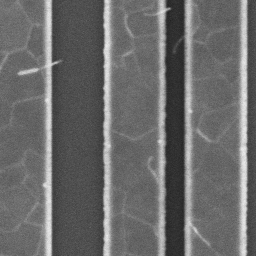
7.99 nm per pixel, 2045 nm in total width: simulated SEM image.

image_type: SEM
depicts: lines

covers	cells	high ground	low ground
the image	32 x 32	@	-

@@@@@@-------@@@@@@@@--@@@@@@@@-
@@@@@@-------@@@@@@@@--@@@@@@@@-
@@@@@@-------@@@@@@@@--@@@@@@@@-
@@@@@@-------@@@@@@@---@@@@@@@@-
@@@@@@-------@@@@@@@@--@@@@@@@@-
@@@@@@-------@@@@@@@@--@@@@@@@@-
@@@@@@-------@@@@@@@@--@@@@@@@@-
@@@@@@-------@@@@@@@---@@@@@@@@-
@@@@@@-------@@@@@@@@--@@@@@@@@-
@@@@@@-------@@@@@@@@--@@@@@@@@-
@@@@@@-------@@@@@@@@--@@@@@@@@-
@@@@@@-------@@@@@@@@--@@@@@@@@-
@@@@@@-------@@@@@@@@--@@@@@@@@-
@@@@@@-------@@@@@@@@--@@@@@@@@-
@@@@@@-------@@@@@@@@--@@@@@@@@-
@@@@@@-------@@@@@@@---@@@@@@@@-
@@@@@@-------@@@@@@@@--@@@@@@@@-
@@@@@@-------@@@@@@@@--@@@@@@@@-
@@@@@@-------@@@@@@@@--@@@@@@@@-
@@@@@@-------@@@@@@@---@@@@@@@@-
@@@@@@-------@@@@@@@@--@@@@@@@@-
@@@@@@-------@@@@@@@---@@@@@@@@-
@@@@@@-------@@@@@@@---@@@@@@@@-
@@@@@@-------@@@@@@@@--@@@@@@@@-
@@@@@@-------@@@@@@@@--@@@@@@@@-
@@@@@@-------@@@@@@@---@@@@@@@@-
@@@@@@-------@@@@@@@---@@@@@@@@-
@@@@@@-------@@@@@@@---@@@@@@@@-
@@@@@@-------@@@@@@@---@@@@@@@@-
@@@@@@-------@@@@@@@---@@@@@@@@-
@@@@@@-------@@@@@@@---@@@@@@@@-
@@@@@@-------@@@@@@@---@@@@@@@@-